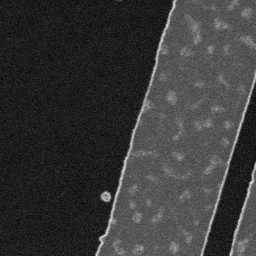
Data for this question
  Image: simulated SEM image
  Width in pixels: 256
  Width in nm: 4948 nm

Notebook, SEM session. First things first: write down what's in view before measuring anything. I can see one or a few lines or trenches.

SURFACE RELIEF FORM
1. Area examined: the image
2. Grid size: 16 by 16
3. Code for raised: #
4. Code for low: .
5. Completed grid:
...........#####
..........######
..........######
..........######
..........######
.........#######
.........######.
.........######.
........#######.
........#######.
........######..
.......#######..
.......#######.#
.......######..#
.......######..#
......#######.##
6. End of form